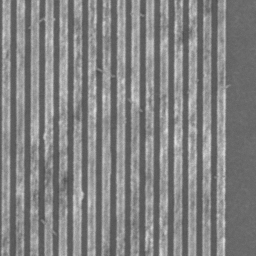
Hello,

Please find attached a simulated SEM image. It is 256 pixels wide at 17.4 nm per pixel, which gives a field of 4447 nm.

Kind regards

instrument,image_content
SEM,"parallel lines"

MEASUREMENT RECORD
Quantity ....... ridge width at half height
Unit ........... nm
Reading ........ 108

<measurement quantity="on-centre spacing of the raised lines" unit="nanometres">249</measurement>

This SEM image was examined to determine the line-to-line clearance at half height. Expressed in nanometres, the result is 139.